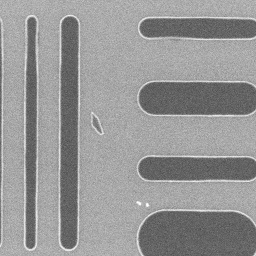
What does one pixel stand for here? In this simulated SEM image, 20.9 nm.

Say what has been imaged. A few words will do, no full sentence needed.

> groups of lines, slits or small figures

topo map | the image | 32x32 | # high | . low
................................
................................
...##...##........##############
...##...##.......###############
...##...##........##############
...##...##......................
...##...##......................
...##...##......................
...##..###......................
...##..###......................
...##..###........#############.
...##..###.......###############
...##..###.......###############
...##..###........##############
...##..###......................
...##..###..#...................
...##..###..#...................
...##..###......................
...##..###......................
...##..###......................
...##..###.......###############
...##..###.......###############
...##..###........##############
...##..###......................
...##..###......................
...##..###......................
...##..###.........###########..
...##..###........#############.
...##..###.......###############
...##..###.......###############
...##...##.......###############
..................##############